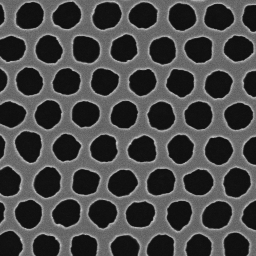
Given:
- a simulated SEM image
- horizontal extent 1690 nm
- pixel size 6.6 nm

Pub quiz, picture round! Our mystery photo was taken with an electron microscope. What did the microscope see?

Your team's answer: a regular array of holes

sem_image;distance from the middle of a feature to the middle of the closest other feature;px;36.9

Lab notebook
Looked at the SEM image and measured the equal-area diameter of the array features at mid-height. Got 180 nanometers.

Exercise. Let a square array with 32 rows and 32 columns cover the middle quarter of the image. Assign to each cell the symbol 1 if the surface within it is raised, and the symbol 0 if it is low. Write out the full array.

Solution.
11111111111111111111111111111111
00111111000011111111001111100011
00001110000001111000000111100000
00001110000000110000000111000000
00001110000000110000000111000000
00001110000001110000000111000000
00001110000011111000001111000000
00111111100111111100011111100001
11111111111111111111111111111011
11110001111111000111111101111111
11100000111110000011110000011110
11000000011100000011110000011110
11000000011100000011100000011100
11000000011100000011100000001100
11100000111100000011100000011100
11110001111110000111110000011110
11111111111111111111111101111111
11111111111111111111111111111111
00011111000011111110001111100001
00001110000001111000000111000000
00001110000001110000000111000000
00001110000001110000000111000000
00011110000001110000000111000000
00011110000001111000000111100000
11111111111111111110011111110011
11111111111111111111111111111111
11110011111111001111111000011111
11100000111100000111110000001110
11000000011000000011100000001100
11000000011000000001100000001100
11000000011000000011100000001100
11000000111000000111100000011110